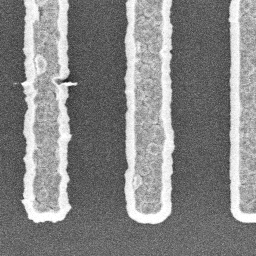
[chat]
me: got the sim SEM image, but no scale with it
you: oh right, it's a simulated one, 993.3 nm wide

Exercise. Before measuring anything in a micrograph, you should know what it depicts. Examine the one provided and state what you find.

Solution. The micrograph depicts one or a few lines or trenches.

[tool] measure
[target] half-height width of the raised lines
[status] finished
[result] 0.14 µm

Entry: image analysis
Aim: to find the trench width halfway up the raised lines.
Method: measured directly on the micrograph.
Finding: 260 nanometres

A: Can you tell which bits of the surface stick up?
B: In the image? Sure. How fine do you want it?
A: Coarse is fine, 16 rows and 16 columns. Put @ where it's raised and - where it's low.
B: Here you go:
--@@----@@-----@
--@@----@@-----@
--@@----@@-----@
--@@----@@-----@
--@@----@@-----@
--@@----@@-----@
--@@----@@-----@
--@@----@@-----@
--@@----@@@----@
--@@----@@-----@
--@@----@@-----@
--@@----@@-----@
--@@----@@-----@
--@@-----@-----@
----------------
----------------